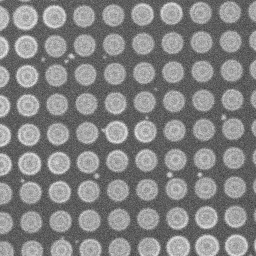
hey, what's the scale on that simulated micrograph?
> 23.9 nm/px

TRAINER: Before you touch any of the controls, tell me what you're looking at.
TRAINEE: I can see an array of small figures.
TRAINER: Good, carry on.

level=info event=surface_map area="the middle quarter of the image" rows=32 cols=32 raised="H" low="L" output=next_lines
HHHHLLHHHHHHLLHHHHLLLLHHHHLLLHHH
HHHLLLLHHHHLLLLHHHLLLLHHHLLLLLHH
HHHLLLLLHHLLLLLHHHLLLLHHHLLLLLHH
HHHLLLLLHHHLLLLHHHLLLLHHHHLLLHHH
HHHHLLLHHHHHLLHHHHHLLHHHHHHHHHHH
HHHHHHHHHHHHHHHHHHHHHHHHHHHHHHHH
HHHHHHHHHHHHHHHHHHHHHHHHHHHHHHHH
HHHHHHHHHHHHLLHHHHHLLHHHHHLLLHHH
HHHHLLLHHHHLLLLHHHLLLLHHHLLLLLHH
LHHLLLLLHHLLLLLHHHLLLLLHHLLLLLHH
LHHLLLLLHHHLLLLHHHLLLLHHHLLLLLHH
HHHHLLLHHHHLLLLHHHHLLHHHHHHLHHHH
HHHHHHHHHHHHHHHHHHHHHHHHHHHHHHHH
HHHHHHHHHHHHHHHHHHHHHHHHHHHHHHHH
HHHHHHHHHHHHHHHHHHHHLHHHHHHLLHHH
HHHHLLLHHHHLLLLHHHLLLLHHHHLLLLHH
LHHHLLLLHHHLLLLHHHLLLLLHHLLLLLHH
LHHLLLLLHHHLLLLLHHLLLLLHHHLLLLHH
LHHHLLLLHHHLLLLHHHHLLLHHHHLLLHHH
HHHHHLLHHHHHHLHHHHHHHHHHHHHHHHHH
HHHHHHHHHHHHHHHHHHHHHHHHHHHHHHHH
HHHHHHHHHHHHHHHHHHHHHHHHHHHHHHHH
HHHHHLLHHHHHLLLHHHHLLLHHHHLLLLHH
LHHHLLLLHHHLLLLLHHLLLLLHHHLLLLHH
LHHHLLLLHHHLLLLLHHLLLLLHHHLLLLHH
LHHHLLLLHHHLLLLHHHHLLLLHHHLLLLHH
HHHHHLLHHHHHLLHHHHHHLHHHHHHHHHHH
HHHHHHHHHHHHHHHHHHHHHHHHHHHHHHHH
HHHHHHHHHHHHHHHHHHHHHHHHHHHHHHHH
HHHHHHLHHHHHLLLHHHHLLLHHHHLLLLHH
LHHHLLLLHHHLLLLLHHHLLLLHHHLLLLHH
LHHHLLLLLHHLLLLLHHLLLLLHHHLLLLLH